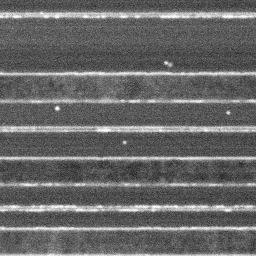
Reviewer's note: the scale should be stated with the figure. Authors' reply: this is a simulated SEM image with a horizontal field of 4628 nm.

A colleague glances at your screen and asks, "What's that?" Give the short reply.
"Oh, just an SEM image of lines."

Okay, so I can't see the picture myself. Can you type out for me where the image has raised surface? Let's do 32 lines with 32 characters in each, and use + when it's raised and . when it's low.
................................
................................
................................
................................
................................
................................
................................
................................
................................
++++++++++++++++++++++++++++++++
++++++++++++++++++++++++++++++++
++++++++++++++++++++++++++++++++
++++++++++++++++++++++++++++++++
................................
................................
................................
................................
................................
................................
................................
++++++++++++++++++++++++++++++++
++++++++++++++++++++++++++++++++
++++++++++++++++++++++++++++++++
................................
................................
................................
................................
................................
................................
++++++++++++++++++++++++++++++++
++++++++++++++++++++++++++++++++
++++++++++++++++++++++++++++++++